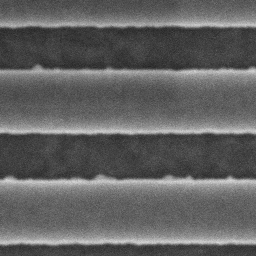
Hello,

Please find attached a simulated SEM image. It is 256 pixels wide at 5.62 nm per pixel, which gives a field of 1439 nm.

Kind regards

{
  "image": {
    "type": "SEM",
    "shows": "lines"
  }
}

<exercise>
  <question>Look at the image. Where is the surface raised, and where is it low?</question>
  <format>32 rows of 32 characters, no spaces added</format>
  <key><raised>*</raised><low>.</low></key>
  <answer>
********************************
********************************
********************************
................................
................................
................................
................................
................................
....*...........................
********************************
********************************
********************************
********************************
********************************
********************************
********************************
********************************
................................
................................
................................
................................
................................
**.*...**.*.**.*********.*******
********************************
********************************
********************************
********************************
********************************
********************************
********************************
*.....*..........*..............
................................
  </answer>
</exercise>